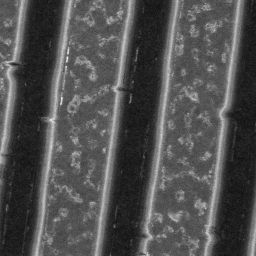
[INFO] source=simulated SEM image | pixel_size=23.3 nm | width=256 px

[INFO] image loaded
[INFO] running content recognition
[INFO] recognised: one or a few lines or trenches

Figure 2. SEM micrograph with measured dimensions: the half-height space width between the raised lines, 0.995 micrometres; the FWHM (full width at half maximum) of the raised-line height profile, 1520 nanometres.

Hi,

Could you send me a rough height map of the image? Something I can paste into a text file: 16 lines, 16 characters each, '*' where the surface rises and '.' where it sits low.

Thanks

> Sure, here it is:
*...****...****.
*...****...****.
*...****...****.
*...****..*****.
*...****..*****.
*..****...****..
*..****...****..
*..****...****..
...****...****..
...****...****..
...****...****..
...****..*****..
...****..*****..
...***...****...
..****...****...
..****...****...